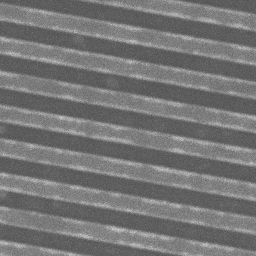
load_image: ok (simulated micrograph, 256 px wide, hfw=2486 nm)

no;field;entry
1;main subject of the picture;parallel lines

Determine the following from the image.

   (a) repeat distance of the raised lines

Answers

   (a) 0.324 µm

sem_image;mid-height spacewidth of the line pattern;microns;0.17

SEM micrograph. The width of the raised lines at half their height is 152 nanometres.